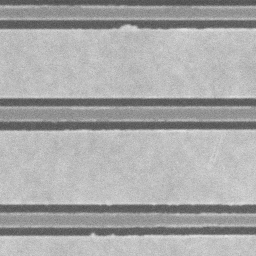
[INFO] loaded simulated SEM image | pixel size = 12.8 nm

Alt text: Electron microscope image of lines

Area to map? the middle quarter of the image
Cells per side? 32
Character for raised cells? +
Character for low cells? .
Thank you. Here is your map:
++++++++++++++++++++++++++++++++
++++++++++++++++++++++++++++++++
++++++++++++++++++++++++++++++++
++++++++++++++++++++++++++++++++
++++++++++++++++++++++++++++++++
++++++++++++++++++++++++++++++++
++++++++++++++++++++++++++++++++
++++++++++++++++++++++++++++++++
................................
................................
................................
++++++++++++++++++++++++++++++++
++++++++++++++++++++++++++++++++
++++++++++++++++++++++++++++++++
................................
................................
................................
++++++++++++++++++++++++++++++++
++++++++++++++++++++++++++++++++
++++++++++++++++++++++++++++++++
++++++++++++++++++++++++++++++++
++++++++++++++++++++++++++++++++
++++++++++++++++++++++++++++++++
++++++++++++++++++++++++++++++++
++++++++++++++++++++++++++++++++
++++++++++++++++++++++++++++++++
++++++++++++++++++++++++++++++++
++++++++++++++++++++++++++++++++
++++++++++++++++++++++++++++++++
++++++++++++++++++++++++++++++++
++++++++++++++++++++++++++++++++
++++++++++++++++++++++++++++++++